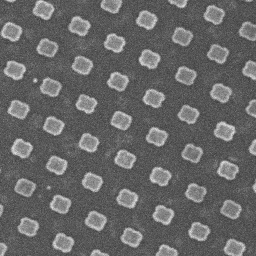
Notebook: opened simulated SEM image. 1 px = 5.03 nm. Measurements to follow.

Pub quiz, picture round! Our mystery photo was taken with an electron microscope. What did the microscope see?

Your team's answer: a regular array of raised bodies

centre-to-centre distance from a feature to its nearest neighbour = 195 nm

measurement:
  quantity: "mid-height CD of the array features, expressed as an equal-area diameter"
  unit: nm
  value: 87